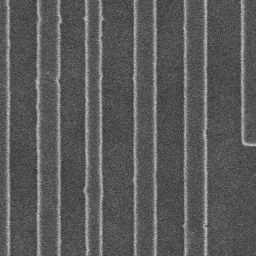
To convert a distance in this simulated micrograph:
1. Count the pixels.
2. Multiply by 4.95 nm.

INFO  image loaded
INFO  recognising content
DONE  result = parallel lines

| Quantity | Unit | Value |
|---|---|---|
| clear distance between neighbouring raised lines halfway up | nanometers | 147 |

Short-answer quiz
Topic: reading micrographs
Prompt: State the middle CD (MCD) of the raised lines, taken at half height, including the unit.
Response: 103 nm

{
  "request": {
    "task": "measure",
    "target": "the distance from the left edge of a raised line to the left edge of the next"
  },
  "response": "48.9 px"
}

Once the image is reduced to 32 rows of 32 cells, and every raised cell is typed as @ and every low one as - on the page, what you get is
@----@@----@@----@@----@@@----@@
@----@@----@@----@@----@@@----@@
@----@@@---@@----@@----@@@----@@
@----@@----@@----@@----@@@----@@
@----@@----@@----@@----@@@----@@
@----@@----@@----@@----@@@----@@
@----@@----@@----@@----@@@----@@
@----@@----@@----@@----@@@----@@
@----@@----@@----@@----@@@----@@
@----@@----@@----@@----@@@----@@
@----@@----@@----@@----@@@----@@
@----@@----@@----@@----@@@----@@
@----@@----@@----@@----@@@----@@
@----@@----@@----@@----@@@----@@
@----@@----@@----@@----@@@----@@
@----@@----@@----@@----@@@----@@
@----@@----@@----@@----@@@----@@
@----@@----@@----@@----@@@----@@
@----@@----@@----@@----@@@------
@----@@----@@----@@----@@@------
@----@@----@@----@@----@@@------
@----@@----@@----@@----@@@------
@----@@----@@----@@----@@@------
@----@@----@@----@@----@@@------
@----@@----@@----@@----@@@------
@----@@----@@----@@----@@@------
@----@@----@@----@@----@@@------
@----@@----@@----@@----@@@------
@----@@----@@----@@----@@@------
@----@@----@@----@@----@@@------
@----@@----@@----@@----@@@------
@----@@----@@----@@----@@@------